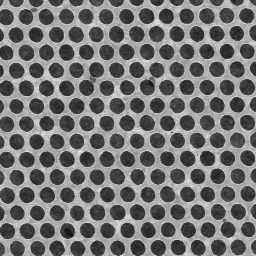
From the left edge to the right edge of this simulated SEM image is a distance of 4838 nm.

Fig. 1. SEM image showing a regular array of holes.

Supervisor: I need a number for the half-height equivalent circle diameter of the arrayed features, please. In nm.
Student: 297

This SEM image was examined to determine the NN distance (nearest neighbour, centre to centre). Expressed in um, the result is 0.377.